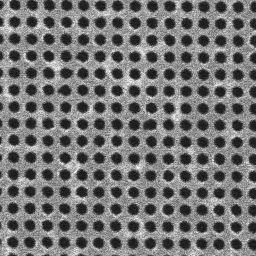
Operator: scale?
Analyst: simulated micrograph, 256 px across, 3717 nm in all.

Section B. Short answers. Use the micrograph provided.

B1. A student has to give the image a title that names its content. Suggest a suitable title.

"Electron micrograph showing a regular array of holes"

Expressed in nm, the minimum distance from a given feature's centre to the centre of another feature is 245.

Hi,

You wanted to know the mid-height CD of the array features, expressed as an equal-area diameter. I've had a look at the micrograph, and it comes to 177 nm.